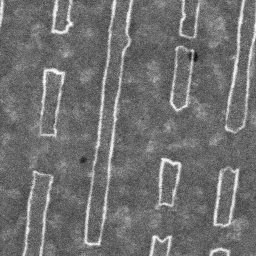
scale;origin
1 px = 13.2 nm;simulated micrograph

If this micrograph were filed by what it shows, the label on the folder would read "parallel lines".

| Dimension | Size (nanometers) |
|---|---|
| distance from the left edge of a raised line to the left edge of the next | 822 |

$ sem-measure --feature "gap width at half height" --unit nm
578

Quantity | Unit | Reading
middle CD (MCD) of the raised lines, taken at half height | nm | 213